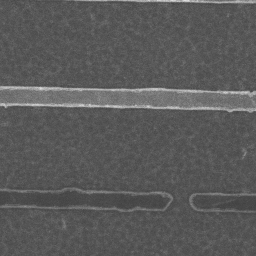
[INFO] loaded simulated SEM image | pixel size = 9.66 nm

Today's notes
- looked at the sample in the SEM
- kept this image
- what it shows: one or a few lines or trenches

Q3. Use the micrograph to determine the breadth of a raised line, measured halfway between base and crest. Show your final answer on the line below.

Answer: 17.6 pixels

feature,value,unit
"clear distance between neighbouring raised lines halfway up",86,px